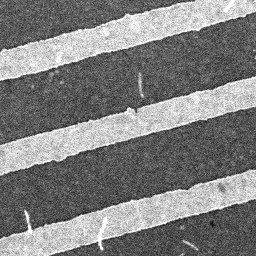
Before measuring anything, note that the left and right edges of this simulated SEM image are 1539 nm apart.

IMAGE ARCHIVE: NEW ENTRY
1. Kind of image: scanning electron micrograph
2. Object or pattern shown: one or a few lines or trenches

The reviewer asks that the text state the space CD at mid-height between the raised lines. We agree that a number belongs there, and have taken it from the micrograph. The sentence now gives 0.373 µm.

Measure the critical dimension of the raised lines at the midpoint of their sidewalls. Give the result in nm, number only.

167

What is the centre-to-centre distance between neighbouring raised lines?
539 nanometers